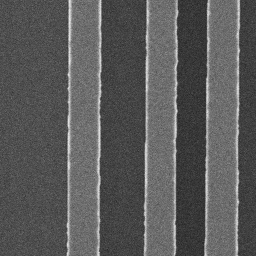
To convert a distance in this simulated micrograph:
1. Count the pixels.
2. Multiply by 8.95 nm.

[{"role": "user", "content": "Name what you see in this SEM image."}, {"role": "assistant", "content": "lines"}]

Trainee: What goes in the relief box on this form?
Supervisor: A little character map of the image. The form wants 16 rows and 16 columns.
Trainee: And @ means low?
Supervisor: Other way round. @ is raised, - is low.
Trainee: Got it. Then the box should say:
----@@---@@--@@-
----@@---@@--@@-
----@@---@@--@@-
----@@---@@--@@-
----@@---@@--@@-
----@@---@@--@@-
----@@---@@--@@-
----@@---@@--@@-
----@@---@@--@@-
----@@---@@--@@-
----@@---@@--@@-
----@@---@@--@@-
----@@---@@--@@-
----@@---@@--@@-
----@@---@@--@@-
----@@---@@--@@-